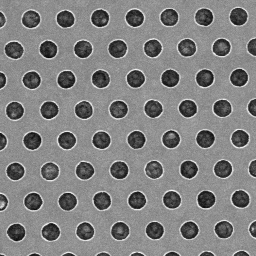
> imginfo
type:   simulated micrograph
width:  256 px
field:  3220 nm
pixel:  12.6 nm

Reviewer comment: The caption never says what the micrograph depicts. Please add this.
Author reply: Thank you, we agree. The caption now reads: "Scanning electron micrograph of a regular array of holes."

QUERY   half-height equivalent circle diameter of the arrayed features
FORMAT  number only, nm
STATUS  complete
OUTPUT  230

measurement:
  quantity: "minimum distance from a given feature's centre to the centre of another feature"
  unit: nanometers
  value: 433